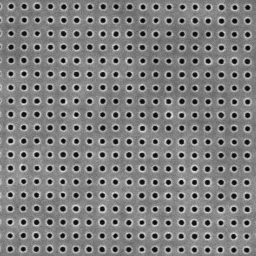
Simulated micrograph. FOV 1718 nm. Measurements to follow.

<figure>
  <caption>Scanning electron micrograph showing a regular array of holes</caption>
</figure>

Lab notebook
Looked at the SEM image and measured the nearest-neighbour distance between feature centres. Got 87.2 nm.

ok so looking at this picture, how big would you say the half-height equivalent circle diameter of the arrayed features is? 36.3 nanometers